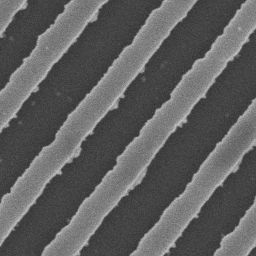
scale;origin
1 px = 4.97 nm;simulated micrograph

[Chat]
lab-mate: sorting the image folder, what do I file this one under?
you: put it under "lines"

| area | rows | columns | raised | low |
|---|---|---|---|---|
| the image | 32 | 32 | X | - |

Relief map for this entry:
XXX-----XXXXX-------XXXX------XX
XX------XXXX-------XXXXX------XX
X------XXXX-------XXXXX------XXX
X-----XXXXX-------XXXX------XXXX
-----XXXXX-------XXXX------XXXX-
-----XXXX-------XXXX-------XXX--
----XXXX-------XXXX-------XXXX--
---XXXX-------XXXXX------XXXX---
--XXXX--------XXXX------XXXX----
-XXXXX-------XXXX------XXXX-----
-XXXX-------XXXX------XXXXX-----
XXXX-------XXXXX------XXXX------
XXX-------XXXXX------XXXX-------
XXX------XXXXX------XXXX-------X
XX-------XXXX------XXXX-------XX
X-------XXXX------XXXX-------XXX
-------XXXX-------XXXX-------XXX
-------XXX-------XXXX-------XXXX
-----XXXXX------XXXX-------XXXX-
-----XXXX------XXXX-------XXXX--
----XXXX------XXXXX------XXXXX--
---XXXX-------XXXX-------XXXX---
--XXXX-------XXXX-------XXXX----
-XXXX-------XXXX-------XXXX-----
-XXXX------XXXX-------XXXX------
XXXX------XXXXX------XXXX-------
XXX-------XXXX------XXXXX------X
XXX------XXXX-------XXXX------XX
XX------XXXX-------XXXX------XXX
X------XXXX-------XXXX------XXXX
------XXXXX------XXXXX------XXXX
-----XXXXX-------XXXX------XXXX-